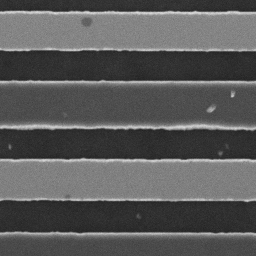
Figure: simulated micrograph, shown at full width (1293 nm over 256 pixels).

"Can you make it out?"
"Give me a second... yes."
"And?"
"lines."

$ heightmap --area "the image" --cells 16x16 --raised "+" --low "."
................
++++++++++++++++
++++++++++++++++
................
................
++++++++++++++++
++++++++++++++++
++++++++++++++++
................
................
++++++++++++++++
++++++++++++++++
++++++++++++++++
................
................
++++++++++++++++